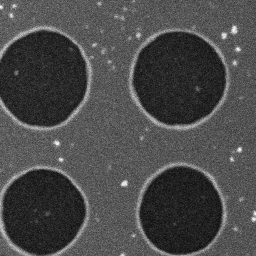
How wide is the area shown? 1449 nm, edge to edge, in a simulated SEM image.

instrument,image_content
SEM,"holes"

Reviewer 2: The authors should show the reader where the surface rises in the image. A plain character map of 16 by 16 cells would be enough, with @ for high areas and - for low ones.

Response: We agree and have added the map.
@@@@@@@@@@@@@@@@
@@@@@@@@@@@@@@@@
@---@@@@@----@@@
-----@@@@-----@@
------@@------@@
-----@@@------@@
-----@@@@-----@@
@---@@@@@@---@@@
@@@@@@@@@@@@@@@@
@@@@@@@@@@@@@@@@
@@@@@@@@@@@-@@@@
@----@@@@----@@@
-----@@@@-----@@
-----@@@@-----@@
-----@@@@-----@@
@---@@@@@@---@@@